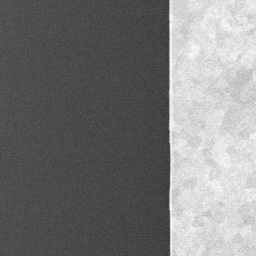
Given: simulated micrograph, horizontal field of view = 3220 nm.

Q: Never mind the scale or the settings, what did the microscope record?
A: wiring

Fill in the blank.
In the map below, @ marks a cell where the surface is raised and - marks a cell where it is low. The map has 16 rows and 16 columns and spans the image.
-----------@@@@@
-----------@@@@@
-----------@@@@@
-----------@@@@@
-----------@@@@@
-----------@@@@@
-----------@@@@@
-----------@@@@@
-----------@@@@@
-----------@@@@@
-----------@@@@@
-----------@@@@@
-----------@@@@@
-----------@@@@@
-----------@@@@@
-----------@@@@@